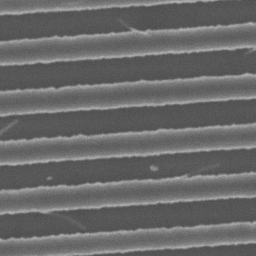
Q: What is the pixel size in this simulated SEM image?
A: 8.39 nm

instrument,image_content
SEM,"lines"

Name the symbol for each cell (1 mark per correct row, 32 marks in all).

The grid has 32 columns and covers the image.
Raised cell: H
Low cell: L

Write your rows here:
HHHHHHHHHHHHHHHHHHHHLLLLLLLLLLLL
HHHHLLLLLLLLLLLLLLLLLLLLLLLLLLLL
LLLLLLLLLLLLLLLLLLLLLLLLLLLLLLLL
LLLLLLLLLLLLLLLLLLLLLLLLLHHHHHHH
LLLLLLLLLLHHHHHHHHHHHHHHHHHHHHHH
HHHHHHHHHHHHHHHHHHHHHHHHHHHHHHHH
HHHHHHHHHHHHHHHHHHHHHHHHLLLLLLLL
HHHHHHHHHLLLLLLLLLLLLLLLLLLLLLLL
LLLLLLLLLLLLLLLLLLLLLLLLLLLLLLLL
LLLLLLLLLLLLLLLLLLLLLLLLLLLLLLHH
LLLLLLLLLLLLLLHHHHHHHHHHHHHHHHHH
HHHHHHHHHHHHHHHHHHHHHHHHHHHHHHHH
HHHHHHHHHHHHHHHHHHHHHHHHHHHHLLLL
HHHHHHHHHHHHHHLLLLLLLLLLLLLLLLLL
LLLLLLLLLLLLLLLLLLLLLLLLLLLLLLLL
LLLLLLLLLLLLLLLLLLLLLLLLLLLLLLLL
LLLLLLLLLLLLLLLLLLHHHHHHHHHHHHHH
LLLLHHHHHHHHHHHHHHHHHHHHHHHHHHHH
HHHHHHHHHHHHHHHHHHHHHHHHHHHHHHHL
HHHHHHHHHHHHHHHHLLLLLLLLLLLLLLLL
HHLLLLLLLLLLLLLLLLLLLLLLLLLLLLLL
LLLLLLLLLLLLLLLLLLLLLLLLLLLLLLLL
LLLLLLLLLLLLLLLLLLLLHHHHHHHHHHHH
LLLLLHHHHHHHHHHHHHHHHHHHHHHHHHHH
HHHHHHHHHHHHHHHHHHHHHHHHHHHHHHHH
HHHHHHHHHHHHHHHHHHLLLLLLLLLLLLLL
HHHLLHLLLLLLLLLLLLLLLLLLLLLLLLLL
LLLLLLLLLLLLLLLLLLLLLLLLLLLLLLLL
LLLLLLLLLLLLLLLLLLLLLLHHHHHHHHHH
LLLLLLLHHHHHHHHHHHHHHHHHHHHHHHHH
HHHHHHHHHHHHHHHHHHHHHHHHHHHHHLLL
HHHHHHHHHHHHHHHHLLLLLLLLLLLLLLLL